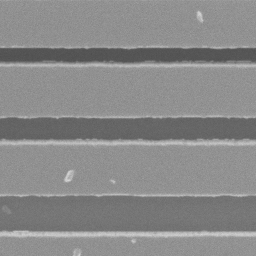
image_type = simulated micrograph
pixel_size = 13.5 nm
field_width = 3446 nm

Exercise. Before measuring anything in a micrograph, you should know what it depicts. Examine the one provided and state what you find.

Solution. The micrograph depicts lines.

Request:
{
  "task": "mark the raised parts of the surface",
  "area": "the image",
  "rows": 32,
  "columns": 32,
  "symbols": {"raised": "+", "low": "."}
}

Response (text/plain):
++++++++++++++++++++++++++++++++
++++++++++++++++++++++++++++++++
++++++++++++++++++++++++++++++++
++++++++++++++++++++++++++++++++
++++++++++++++++++++++++++++++++
++++++++++++++++++++++++++++++++
................................
................................
++++++++++++++++++++++++++++++++
++++++++++++++++++++++++++++++++
++++++++++++++++++++++++++++++++
++++++++++++++++++++++++++++++++
++++++++++++++++++++++++++++++++
++++++++++++++++++++++++++++++++
++++++++++++++++++++++++++++++++
................................
................................
................................
++++++++++++++++++++++++++++++++
++++++++++++++++++++++++++++++++
++++++++++++++++++++++++++++++++
++++++++++++++++++++++++++++++++
++++++++++++++++++++++++++++++++
++++++++++++++++++++++++++++++++
................................
................................
................................
................................
................................
++++++++++++++++++++++++++++++++
++++++++++++++++++++++++++++++++
++++++++++++++++++++++++++++++++